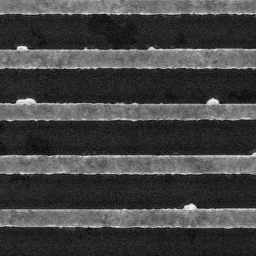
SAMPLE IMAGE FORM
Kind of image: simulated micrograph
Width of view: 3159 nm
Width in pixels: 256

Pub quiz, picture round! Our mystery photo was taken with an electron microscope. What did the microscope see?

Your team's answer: lines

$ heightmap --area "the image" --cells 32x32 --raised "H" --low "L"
HHHHHHHHHHHHHHHHHHHHHHHHHHHHHHHH
HHHHHHHHHHHHHHHHHHHHHHHHHHHHHHHH
LLLLLLLLLLLLLLLLLLLLLLLLLLLLLLLL
LLLLLLLLLLLLLLLLLLLLLLLLLLLLLLLL
LLLLLLLLLLLLLLLLLLLLLLLLLLLLLLLL
LLLLLLLLLLLLLLLLLLLLLLLLLLLLLLLL
HHHHHHHHHHHHHHHHHHHHHHHHHHHHHHHH
HHHHHHHHHHHHHHHHHHHHHHHHHHHHHHHH
HHHHHHHHHHHHLLHLLHHHHHLLHHHHHHHH
LLLLLLLLLLLLLLLLLLLLLLLLLLLLLLLL
LLLLLLLLLLLLLLLLLLLLLLLLLLLLLLLL
LLLLLLLLLLLLLLLLLLLLLLLLLLLLLLLL
LLLLLLLLLLLLLLLLLLLLLLLLLLLLLLLL
HHHHHHHHHHHHHHHHHHHHHHHHHHHHHHHH
HHHHHHHHHHHHHHHHHHHHHHHHHHHHHHHH
LLLLLLLLLLLLLLLLLLLLLLLLLLLLLLLL
LLLLLLLLLLLLLLLLLLLLLLLLLLLLLLLL
LLLLLLLLLLLLLLLLLLLLLLLLLLLLLLLL
LLLLLLLLLLLLLLLLLLLLLLLLLLLLLLLL
LLLLLLLLLLLLLLLLLLLLLLLLLLLLLLLL
HHHHHHHHHHHHHHHHHHHHHHHHHHHHHHHH
HHHHHHHHHHHHHHHHHHHHHHHHHHHHHHHH
LLLLLLLLLLLLLLLLLLLLLLLLLLLLLLLL
LLLLLLLLLLLLLLLLLLLLLLLLLLLLLLLL
LLLLLLLLLLLLLLLLLLLLLLLLLLLLLLLL
LLLLLLLLLLLLLLLLLLLLLLLLLLLLLLLL
HHHHHHHHHHHHHHHHHHHHHHHHHHHHHHHH
HHHHHHHHHHHHHHHHHHHHHHHHHHHHHHHH
LLLLLLLLLLLLLLLLLLLLLLLLLLLLLLLL
LLLLLLLLLLLLLLLLLLLLLLLLLLLLLLLL
LLLLLLLLLLLLLLLLLLLLLLLLLLLLLLLL
LLLLLLLLLLLLLLLLLLLLLLLLLLLLLLLL